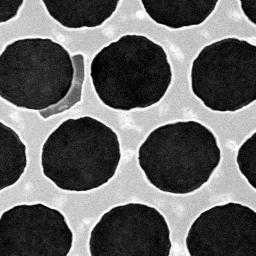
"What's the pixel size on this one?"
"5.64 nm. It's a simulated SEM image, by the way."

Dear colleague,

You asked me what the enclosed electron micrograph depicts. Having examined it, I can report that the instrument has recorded holes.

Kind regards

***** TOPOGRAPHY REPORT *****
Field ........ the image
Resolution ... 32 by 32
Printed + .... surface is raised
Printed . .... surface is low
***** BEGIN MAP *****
...+++.........+++.........+++..
..++++........++++........++++..
.++++++......++++++.......+++++.
+++++++++.+++++++++++.++++++++++
+++++++++++++++...++++++++++++++
+......+++++++......++++++.....+
.........+++.........++++.......
..........++.........+++........
.....................+++........
.....................+++........
..........++.........+++........
..........++.........+++........
+.........+++.......+++++.......
+++......+++++...+++++++++....++
+++++.++++++++++++++++++++++++++
++++++++.....++++++++....+++++++
..+++++.......+++++.......++++++
...+++.........+++.........++++.
...++..........++..........+++..
...++..........++..........+++..
...++..........++..........+++..
...++.........++++.........+++..
..++++........+++++.......+++++.
.+++++++....++++++++.....+++++++
++++++++++++++++++++++++++++++++
++++.+++++++++++..++++++++++..++
+......++++++.......+++++.......
........++++.........+++........
.........+++.........+++........
.........++..........++.........
.........++..........++.........
.........++..........+++........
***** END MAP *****